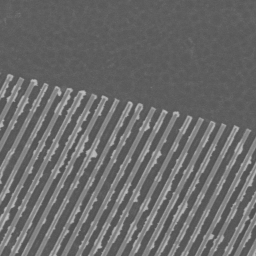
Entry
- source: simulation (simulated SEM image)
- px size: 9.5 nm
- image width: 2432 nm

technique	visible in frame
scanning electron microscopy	parallel lines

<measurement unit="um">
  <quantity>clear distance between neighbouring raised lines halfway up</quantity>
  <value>0.0655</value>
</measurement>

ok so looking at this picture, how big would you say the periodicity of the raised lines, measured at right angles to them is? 112 nm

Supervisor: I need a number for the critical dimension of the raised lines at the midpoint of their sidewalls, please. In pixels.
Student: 4.89